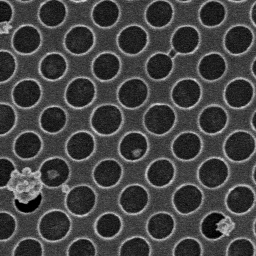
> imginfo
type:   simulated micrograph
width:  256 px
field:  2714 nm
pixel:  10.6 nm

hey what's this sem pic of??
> a regular array of holes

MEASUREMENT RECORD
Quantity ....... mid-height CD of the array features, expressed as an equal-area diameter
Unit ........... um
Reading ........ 0.295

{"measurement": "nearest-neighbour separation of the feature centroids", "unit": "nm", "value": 392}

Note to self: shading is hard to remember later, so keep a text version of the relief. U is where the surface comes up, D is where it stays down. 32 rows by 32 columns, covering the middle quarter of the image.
DUUUUUUDDDDDDDUUUUUUUDDDDDDUUUUU
UUUUUUUDDDDDDDUUUUUUUDDDDDDUUUUU
UUUUUUUDDDDDDUUUUUUUUDDDDDUUUUUU
UUUUDUUUDDDDUUUUUUUUUUDDDUUUUUUU
UUDDDDDUUUUUUUUDDDDDUUUUUUUUUDDD
UDDDDDDDUUUUUUDDDDDDDUUUUUUUDDDD
UDDDDDDDUUUUUUDDDDDDDUUUUUUDDDDD
DDDDDDDDUUUUUDDDDDDDDUUUUUUDDDDD
DDDDDDDUUUUUUUDDDDDDDUUUUUUDDDDD
UDDDDDUUUUUUUUDDDDDDUUUUUUUDDDDD
UUDDDUUUUDDDDUUDDDDUUUDDDDUUDDDD
UUUUUUUUDDDDDDUUUUUUUDDDDDDUUUUU
UUUUUUUDDDDDDDUUUUUUDDDDDDDDUUUU
UUUUUUUDDDDDDDUUUUUUDDDDDDDDUUUU
UUUUUUUDDDDDDDUUUUUUDDDDDDDDUUUU
UUUUUUUDDDDDDDUUUUUUDDDDDDDUUUUU
UUUUUUUUDDDDDUUUUUUUUDDDDDUUUUUU
UUUDDDUUUDDDUUUUDDDUUUUDDUUUUDDD
UUDDDDDUUUUUUUUDDDDDUUUUUUUUDDDD
UDDDDDDDUUUUUUDDDDDDDUUUUUUDDDDD
UDDDDDDDUUUUUUDDDDDDDUUUUUUDDDDD
UDDDDDDUUUUUUUDDDDDDDUUUUUUDDDDD
UDDDDDDUUUUUUUDDDDDDUUUUUUUUDDDD
UUDDDUUUUUUUUUUDDDDUUUUUUUUUUDDD
UUUUUUUUUDDDDUUUUUUUUUDDDDDUUUUU
DUUUUUUUDDDDDDUUUUUUUUDDDDDUUUUU
DUUUUUUUDDDDDDUUUUUUUDDDDDDDUUUU
DUUUUUUDDDDDDDUUUUUUUDDDDDDUUUUU
DUUUUUUDDDDDDDUUUUUUUDDDDDDUUUUU
UUUUUUUUDDDDDUUUUUUUUUDDDDUUUUUU
UUUUDDUUUDDDUUUUUDDUUUUDDUUUUUDD
UUDDDDDUUUUUUUUDDDDDUUUUUUUUDDDD